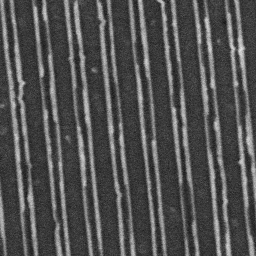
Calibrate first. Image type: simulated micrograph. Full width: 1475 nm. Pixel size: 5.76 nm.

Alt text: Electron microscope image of parallel lines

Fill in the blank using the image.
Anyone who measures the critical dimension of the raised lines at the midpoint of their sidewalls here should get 72.4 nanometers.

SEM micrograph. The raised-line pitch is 184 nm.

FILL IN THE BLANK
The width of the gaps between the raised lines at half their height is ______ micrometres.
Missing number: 0.111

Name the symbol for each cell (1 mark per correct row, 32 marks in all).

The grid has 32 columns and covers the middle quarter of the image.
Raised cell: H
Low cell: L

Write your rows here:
LLHHHLLLLLHHHLLLLLHHHLLLLLHHHLLL
LLHHHLLLLLHHHLLLLLHHHLLLLLHHHLLL
LLHHHLLLLLHHHLLLLLHHHLLLLLHHHLLL
LLHHHLLLLLHHHLLLLLHHHLLLLLHHHLLL
LLHHHLLLLLHHHLLLLLHHHLLLLLHHHLLL
LLHHHLLLLLHHHLLLLLLHHHLLLLLHHHLL
LLHHHHLLLLHHHLLLLLLHHHLLLLLHHHLL
LLHHHHLLLLLHHLLLLLLHHHLLLLLHHHLL
LLLHHHLLLLLHHHLLLLLHHHLLLLLHHHLL
LLLHHHLLLLLHHHLLLLLHHHLLLLLHHHLL
LLLHHHLLLLLHHHLLLLLHHHLLLLLHHHLL
LLLHHHLLLLLHHHLLLLLHHHLLLLLHHHLL
LLLHHHLLLLLHHHLLLLLHHHLLLLLHHHLL
LLLHHHLLLLLHHHLLLLLHHHLLLLLHHHLL
LLLHHHLLLLLHHHLLLLLHHHLLLLLHHHLL
LLLHHHLLLLLHHHLLLLLHHHLLLLLHHHLL
LLLLHHHLLLLHHHLLLLLLHHHLLLLHHHHL
LLLLHHHLLLLHHHLLLLLLHHHLLLLLHHLL
LLLLHHHLLLLLHHHLLLLLHHHLLLLLHHHL
LLLLHHHLLLLLHHHLLLLLHHHLLLLLHHHL
LLLLHHHLLLLLHHHLLLLLHHHLLLLLHHHL
LLLLHHHLLLLLHHHLLLLLHHHLLLLLHHHL
LLLLHHHLLLLLHHHLLLLLHHHLLLLLHHHL
LLLLHHHLLLLLHHHLLLLLHHHLLLLLHHHL
LLLLHHHLLLLLHHHLLLLLHHHLLLLLHHHL
LLLLHHHLLLLLHHHLLLLLHHHLLLLLHHHL
LLLLLHHLLLLLLHHHLLLLLHHHLLLLLHHL
LLLLLHHLLLLLLHHHLLLLLHHLLLLLLHHL
LLLLLHHHLLLLLHHHLLLLLHHHLLLLLHHH
LLLLLHHHLLLLLHHHLLLLLHHHLLLLLHHH
LLLLLHHHLLLLLHHHLLLLLHHHLLLLLHHH
LLLLLHHHLLLLLHHHLLLLLHHHLLLLLHHH